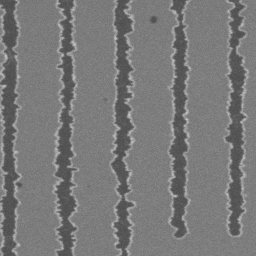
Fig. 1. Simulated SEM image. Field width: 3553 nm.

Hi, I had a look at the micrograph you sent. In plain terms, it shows parallel lines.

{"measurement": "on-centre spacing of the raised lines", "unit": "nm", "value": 789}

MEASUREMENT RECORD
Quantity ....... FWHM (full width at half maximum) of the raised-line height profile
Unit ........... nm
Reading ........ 612